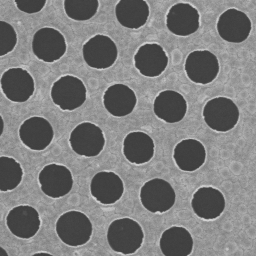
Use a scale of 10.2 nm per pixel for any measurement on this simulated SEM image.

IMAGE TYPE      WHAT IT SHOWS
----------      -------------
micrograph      a regular array of holes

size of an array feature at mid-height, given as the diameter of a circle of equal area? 341 nm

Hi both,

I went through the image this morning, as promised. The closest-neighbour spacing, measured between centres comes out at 519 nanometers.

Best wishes